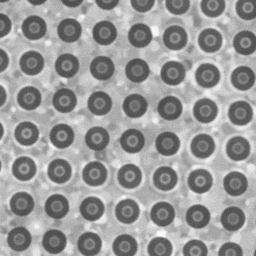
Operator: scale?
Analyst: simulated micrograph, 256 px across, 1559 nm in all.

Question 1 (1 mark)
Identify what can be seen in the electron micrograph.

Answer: an array of small figures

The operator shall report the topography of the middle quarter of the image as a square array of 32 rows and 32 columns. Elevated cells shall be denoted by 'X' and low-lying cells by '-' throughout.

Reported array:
XX--XX--XXX--XXX-----XXX------XX
----XX---XX--XX--XXX--XX--XX---X
---XXXX-----XXX--XX--XXX--XX---X
--XXXXX-----XXXX-----XXX---X---X
XXXXXXXXXXXXXXXXX---XXXXX-----XX
XXXXXXXXXXXXXXXXXXXXXXXXXX---XXX
--XXXXXXXXXXXXXXXXXXXXXXXXXXXXXX
---XXXX----XXXXXX--XXXXXXXXXXXXX
X--XXX------XXX-----XXXXX----XXX
X--XXX--XX--XXX--X---XXX------XX
---XXX--XX--XXX-XXX--XX--XXX--XX
--XXXX------XXX--X---XX--XXX--XX
XXXXXXX----XXXX-----XXXX-----XXX
XXXXXXXXXXXXXXXXX--XXXXX-----XXX
XXXXXXXXXXXXXXXXXXXXXXXXXXXXXXXX
--XXXXXXXXXXXXXXXXXXXXXXXXXXXXXX
--XXXX-----XXXX----XXXXXXXXXXXXX
---XX------XXX------XXXX----XXXX
---XX--XX---XX--XX--XXX------XXX
--XXX---X--XXX--XX--XXX--XX--XX-
--XXXX-----XXX------XXX--XX--XX-
XXXXXXX---XXXXX----XXXX------XX-
XXXXXXXXXXXXXXXXX-XXXXXX----XXXX
XXXXXXXXXXXXXXXXXXXXXXXXXXXXXXXX
-XXXXX---XXXXXXXXXXXXXXXXXXXXXXX
--XXX-----XXXX-----XXXXX--XXXXXX
--XX---X---XX------XXXX-----XXXX
--XX---XX--XX---X---XX-------XX-
--XX---X---XX---X---XX--XX---XX-
-XXXX------XX-------XX---X---XX-
XXXXXX----XXXX-----XXX------XXX-
XXXXXXXXXXXXXXXX-XXXXXX----XXXX-